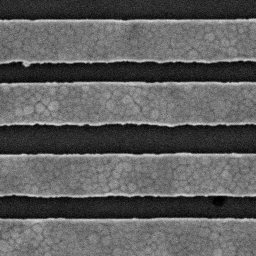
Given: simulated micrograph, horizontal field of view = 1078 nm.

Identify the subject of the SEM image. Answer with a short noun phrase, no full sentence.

lines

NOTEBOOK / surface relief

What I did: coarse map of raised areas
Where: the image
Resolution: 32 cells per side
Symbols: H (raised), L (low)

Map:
LLLLLLLLLLLLLLLLLLLLLLLLLLLLLLLL
LLLLLLLLLLLLLLLLLLLLLLLLLLLLLLLL
LLLLLLLLLLLLLLLLLLLLLLLLLLLLLHLH
HHHHHHHHHHHHHHHHHHHHHHHHHHHHHHHH
HHHHHHHHHHHHHHHHHHHHHHHHHHHHHHHH
HHHHHHHHHHHHHHHHHHHHHHHHHHHHHHHH
HHHHHHHHHHHHHHHHHHHHHHHHHHHHHHHH
HHHHHHHHHHHHHHHHHHHHHHHHHHHHHHHH
LLLLLLLLLLLLLLLLLLLLLLLLLLLLLLLL
LLLLLLLLLLLLLLLLLLLLLLLLLLLLLLLL
HHHHHHHHHHHHHHHHHHHHHHHHHHHHHHHH
HHHHHHHHHHHHHHHHHHHHHHHHHHHHHHHH
HHHHHHHHHHHHHHHHHHHHHHHHHHHHHHHH
HHHHHHHHHHHHHHHHHHHHHHHHHHHHHHHH
HHHHHHHHHHHHHHHHHHHHHHHHHHHHHHHH
HHHHHHHHHHHHHHLLLHHHHHHHHHHHHHHH
LLLLLLLLLLLLLLLLLLLLLLLLLLLLLLLL
LLLLLLLLLLLLLLLLLLLLLLLLLLLLLLLL
LLLLLLLLLLLLLLLLLLLLLLLLLLLLLLLL
HHHHHHHHHHHHHHHHHHHHHHHHHHHHHHHH
HHHHHHHHHHHHHHHHHHHHHHHHHHHHHHHH
HHHHHHHHHHHHHHHHHHHHHHHHHHHHHHHH
HHHHHHHHHHHHHHHHHHHHHHHHHHHHHHHH
HHHHHHHHHHHHHHHHHHHHHHHHHHHHHHHH
LLLLHHHHHHHLLLLLLLLLLLLLLLLLLLLL
LLLLLLLLLLLLLLLLLLLLLLLLLLLLLLLL
LLLLLLLLLLLLLLLLLLLLLLLLLLLLLLLL
HHHHHHHHHHHHHHHHHHHHHHHHHHHHHHHH
HHHHHHHHHHHHHHHHHHHHHHHHHHHHHHHH
HHHHHHHHHHHHHHHHHHHHHHHHHHHHHHHH
HHHHHHHHHHHHHHHHHHHHHHHHHHHHHHHH
HHHHHHHHHHHHHHHHHHHHHHHHHHHHHHHH